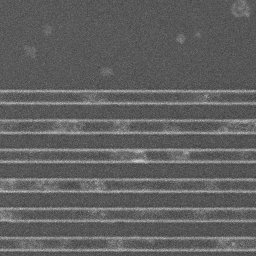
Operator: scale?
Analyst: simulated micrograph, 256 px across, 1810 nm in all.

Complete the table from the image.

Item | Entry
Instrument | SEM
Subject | parallel lines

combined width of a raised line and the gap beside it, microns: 0.207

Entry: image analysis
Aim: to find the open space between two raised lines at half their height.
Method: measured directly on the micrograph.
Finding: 112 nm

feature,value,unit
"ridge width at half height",97.2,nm